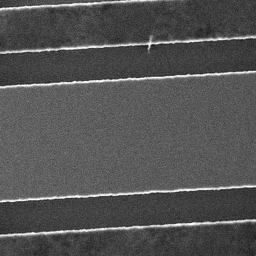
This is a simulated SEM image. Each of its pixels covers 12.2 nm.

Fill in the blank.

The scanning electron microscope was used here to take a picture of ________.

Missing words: lines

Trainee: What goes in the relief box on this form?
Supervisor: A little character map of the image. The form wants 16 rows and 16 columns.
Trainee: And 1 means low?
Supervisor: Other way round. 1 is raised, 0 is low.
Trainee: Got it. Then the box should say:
0111111111111111
1111111111111111
1111111111111100
0000000000000000
0000000000000001
1111111111111111
1111111111111111
1111111111111111
1111111111111111
1111111111111111
1111111111111111
1111111111111111
1100000000000000
0000000000000000
0001111111111111
1111111111111111